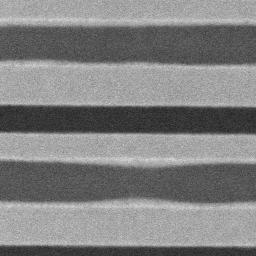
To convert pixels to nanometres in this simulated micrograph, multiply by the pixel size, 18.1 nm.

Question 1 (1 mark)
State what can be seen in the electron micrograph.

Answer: lines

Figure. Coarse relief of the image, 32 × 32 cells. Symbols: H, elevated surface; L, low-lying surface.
HHHHHHHHHHHHHHHHHHHHHHHHHHHHHHHH
HHHHHHHHHHHHHHHHHHHHHHHHHHHHHHHH
LLLLHHHHHHHHHHHHHHHHHHHHHHHHHHHH
LLLLLLLLLLLLLLLLLLLLLLLLLLLLLLLL
LLLLLLLLLLLLLLLLLLLLLLLLLLLLLLLL
LLLLLLLLLLLLLLLLLLLLLLLLLLLLLLLL
LLLLLLLLLLLLLLLLLLLLLLLLLLLLLLLL
LLLLLLLLLLLLLLLLLLLLLLLLLLLLLLLL
HHHHHHHHHHHHHHHHHHHHHHHHHHHHHHHH
HHHHHHHHHHHHHHHHHHHHHHHHHHHHHHHH
HHHHHHHHHHHHHHHHHHHHHHHHHHHHHHHH
HHHHHHHHHHHHHHHHHHHHHHHHHHHHHHHH
HHHHHHHHHHHHHHHHHHHHHHHHHHHHHHHH
LLLLLLLLLLLLLLLLLLLLLLLLLLLLLLLL
LLLLLLLLLLLLLLLLLLLLLLLLLLLLLLLL
LLLLLLLLLLLLLLLLLLLLLLLLLLLLLLLL
LLLLLLLLLLLLLLLLLLLLLLLLLLLLLLLL
HHHHHHHHHHHHHHHHHHHHHHHHHHHHHHHH
HHHHHHHHHHHHHHHHHHHHHHHHHHHHHHHH
HHHHHHHHHHHHHHHHHHHHHHHHHHHHHHHH
LLLLLLLLLLLLLLLLLLLLLLLLLLLLLLLL
LLLLLLLLLLLLLLLLLLLLLLLLLLLLLLLL
LLLLLLLLLLLLLLLLLLLLLLLLLLLLLLLL
LLLLLLLLLLLLLLLLLLLLLLLLLLLLLLLL
LLLLLLLLLLLLLLLLLLLLLLLLLLLLLLLL
LLLLLLLLLLLLLLLLLLLLLLLLLLLLLLLL
HHHHHHHHHHHHHHHHHHHHHHHHHHHHHHHH
HHHHHHHHHHHHHHHHHHHHHHHHHHHHHHHH
HHHHHHHHHHHHHHHHHHHHHHHHHHHHHHHH
HHHHHHHHHHHHHHHHHHHHHHHHHHHHHHHH
HHHHHHHHHHHHHHHHHHHHHHHHHHHHHHHH
LLLLLLLLLLLLLLLLLLLLLLLLLLLLLLLL